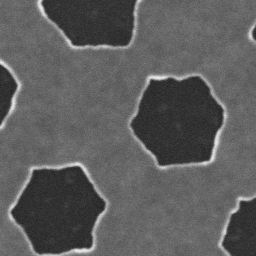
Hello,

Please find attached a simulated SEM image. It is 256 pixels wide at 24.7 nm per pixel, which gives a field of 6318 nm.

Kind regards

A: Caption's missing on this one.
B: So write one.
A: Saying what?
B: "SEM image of holes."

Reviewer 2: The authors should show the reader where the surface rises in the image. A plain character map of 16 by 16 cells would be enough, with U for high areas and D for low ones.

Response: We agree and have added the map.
UUUDDDDDUUUUUUUU
UUUDDDDDUUUUUUUU
UUUUDDDDUUUUUUUU
UUUUUUUUUUUUUUUU
DUUUUUUUUUUUUUUU
DUUUUUUUUDDDDUUU
DUUUUUUUUDDDDDUU
UUUUUUUUDDDDDDUU
UUUUUUUUUDDDDDUU
UUUUUUUUUDDDDUUU
UUUUDUUUUUUUUUUU
UUDDDDUUUUUUUUUU
UDDDDDUUUUUUUUUD
UDDDDDUUUUUUUUUD
UDDDDDUUUUUUUUDD
UUDDDUUUUUUUUUDD